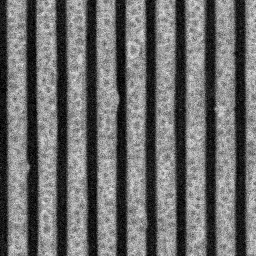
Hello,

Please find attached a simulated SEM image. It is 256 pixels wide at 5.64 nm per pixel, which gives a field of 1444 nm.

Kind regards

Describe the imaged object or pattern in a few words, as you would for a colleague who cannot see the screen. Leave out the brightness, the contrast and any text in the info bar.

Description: parallel lines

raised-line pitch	168	nanometres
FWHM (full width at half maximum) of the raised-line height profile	106	nanometers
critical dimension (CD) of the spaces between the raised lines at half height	10.9	px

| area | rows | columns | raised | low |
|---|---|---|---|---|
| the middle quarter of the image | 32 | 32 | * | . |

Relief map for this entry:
.****...*****...****...*****...*
.****...*****...****...****....*
.****...*****...****...****....*
.****...*****...****...****....*
.****...*****...****...****....*
.****...*****...****...*****...*
.****...*****...****...*****...*
.****...******..****...*****...*
.****...******..****...*****...*
.****...******..****...*****...*
.****...*****...****...****....*
.****...*****...****...****....*
.****...*****...****...****....*
.****...*****...****...****....*
.****...*****...****...****....*
.****...*****...****...****....*
.****...*****...****...****....*
.****...*****...****...*****...*
.****...*****...****...*****...*
.****...*****...****...*****...*
.****...*****...****...*****...*
.****...*****...****...*****...*
.****...*****...****...*****...*
.****...*****...****...*****...*
.*****..*****...****...*****...*
.*****..*****...****...*****...*
.*****..*****...****...*****...*
.*****..*****...****...*****...*
.*****..*****...****...*****...*
.*****..*****...****...*****...*
.*****...****...****...*****...*
.*****...****...****...*****...*